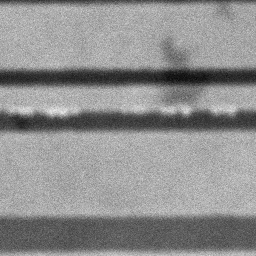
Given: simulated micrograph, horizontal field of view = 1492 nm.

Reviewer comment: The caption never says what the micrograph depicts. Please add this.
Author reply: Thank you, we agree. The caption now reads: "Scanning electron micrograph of lines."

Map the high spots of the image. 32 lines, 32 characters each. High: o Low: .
..o........o..o.ooooo..ooooooooo
oooooooooooooooooooooooooooooooo
oooooooooooooooooooooooooooooooo
oooooooooooooooooooooooooooooooo
oooooooooooooooooooooooooooooooo
oooooooooooooooooooooooooooooooo
oooooooooooooooooooooooooooooooo
oooooooooooooooooooooooooooooooo
oooooooo.....o..oo.ooo..........
................................
................................
oooooooooooooooooooooooooooooooo
oooooooooooooooooooooooooooooooo
oooooooooooooooooooooooooooooooo
................................
................................
............................oo..
oooooooooooooooooooooooooooooooo
oooooooooooooooooooooooooooooooo
oooooooooooooooooooooooooooooooo
oooooooooooooooooooooooooooooooo
oooooooooooooooooooooooooooooooo
oooooooooooooooooooooooooooooooo
oooooooooooooooooooooooooooooooo
oooooooooooooooooooooooooooooooo
oooooooooooooooooooooooooooooooo
oooooooooooooooooooooooooooooooo
................................
................................
................................
................................
................................